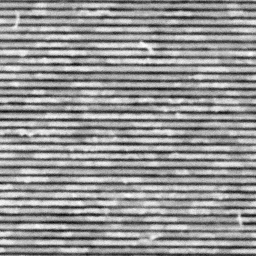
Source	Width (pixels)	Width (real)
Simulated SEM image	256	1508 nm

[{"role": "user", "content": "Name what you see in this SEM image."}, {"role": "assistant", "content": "parallel lines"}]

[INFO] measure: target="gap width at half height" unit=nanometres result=22.1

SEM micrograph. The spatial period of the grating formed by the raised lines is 46.6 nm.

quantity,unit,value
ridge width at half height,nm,22.1